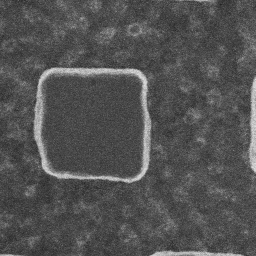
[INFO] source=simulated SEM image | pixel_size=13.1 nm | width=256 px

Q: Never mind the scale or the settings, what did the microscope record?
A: raised bodies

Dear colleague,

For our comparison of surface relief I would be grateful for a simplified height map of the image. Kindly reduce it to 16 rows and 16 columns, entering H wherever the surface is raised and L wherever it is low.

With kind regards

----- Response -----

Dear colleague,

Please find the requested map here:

LLLLLLLLLLLLLLLL
LLLLLLLLLLLLLLLL
LLLLLLLLLLLLLLLL
LLLLLLLLLLLLLLLL
LLLHHHHHLLLLLLLL
LLHHHHHHHLLLLLLL
LLHHHHHHHLLLLLLL
LLHHHHHHHLLLLLLL
LLHHHHHHHLLLLLLL
LLLHHHHHHLLLLLLL
LLLHHHHHHLLLLLLL
LLLLLLLLLLLLLLLL
LLLLLLLLLLLLLLLL
LLLLLLLLLLLLLLLL
LLLLLLLLLLLLLLLL
LLLLLLLLLLLLLLLL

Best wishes